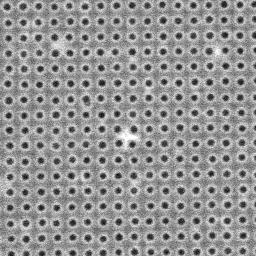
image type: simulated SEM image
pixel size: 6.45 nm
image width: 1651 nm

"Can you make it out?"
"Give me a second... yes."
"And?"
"a regular array of holes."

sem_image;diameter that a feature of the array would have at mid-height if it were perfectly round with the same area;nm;50.4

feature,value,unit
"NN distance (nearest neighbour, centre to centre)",96.3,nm